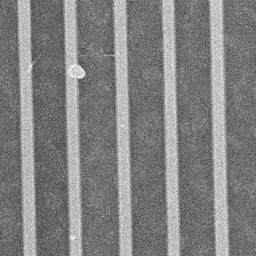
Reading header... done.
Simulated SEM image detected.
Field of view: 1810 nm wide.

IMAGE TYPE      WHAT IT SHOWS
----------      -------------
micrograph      parallel lines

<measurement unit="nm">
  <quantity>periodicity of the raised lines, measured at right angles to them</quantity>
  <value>339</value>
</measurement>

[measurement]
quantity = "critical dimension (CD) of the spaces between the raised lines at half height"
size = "257 nanometres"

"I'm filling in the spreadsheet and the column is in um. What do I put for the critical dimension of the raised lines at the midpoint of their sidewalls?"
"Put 0.0822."